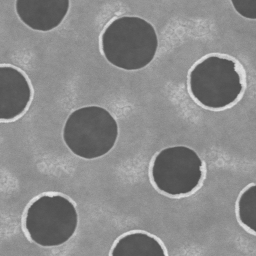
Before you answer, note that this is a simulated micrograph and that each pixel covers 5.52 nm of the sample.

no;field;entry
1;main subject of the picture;holes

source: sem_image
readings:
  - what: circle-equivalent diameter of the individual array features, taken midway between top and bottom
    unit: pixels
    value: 50.6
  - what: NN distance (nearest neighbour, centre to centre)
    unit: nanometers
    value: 521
